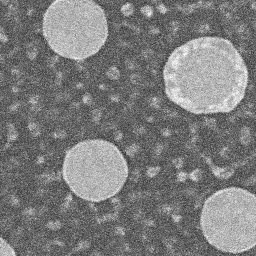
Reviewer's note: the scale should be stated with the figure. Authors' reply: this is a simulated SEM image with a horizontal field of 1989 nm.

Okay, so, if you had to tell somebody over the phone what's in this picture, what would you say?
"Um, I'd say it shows raised bodies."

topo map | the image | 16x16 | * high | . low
...***..........
...****.........
...****.....**..
....*......****.
..........*****.
..........*****.
...........****.
................
................
....***.........
....****........
....****........
.............***
.............***
.............***
*.............**